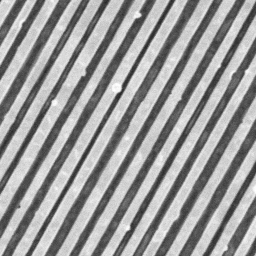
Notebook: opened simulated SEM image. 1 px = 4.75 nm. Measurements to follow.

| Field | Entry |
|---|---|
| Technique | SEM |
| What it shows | parallel lines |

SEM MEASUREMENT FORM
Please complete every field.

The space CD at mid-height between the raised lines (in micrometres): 0.0471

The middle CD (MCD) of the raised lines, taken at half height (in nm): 47.1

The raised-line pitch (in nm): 90.8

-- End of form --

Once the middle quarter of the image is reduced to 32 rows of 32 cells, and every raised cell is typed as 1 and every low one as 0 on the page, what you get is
00011100011000111001110001110001
00111000110001110011100011100011
01111001110001110011100011100111
01110001100011100111000111000111
11100011100011100110000110001110
11100011000111001110001110001110
11000111000111001100001100011100
11000110001110011000011100011000
10001100011100111000111000111000
10011100011100110000111000110001
00011000111001110001110001110001
00111000111001100011110011100011
00110001110011100011100011100011
01100001100111000111000111000110
01100011100111000111000110001110
11000011001110001110001110001100
11000111001100001110001100011100
10001110011100011100011100011001
10001110011000011100111000111001
00011100111000111000111000110011
00011101110000111001110001110011
00111001110001110001110011100111
00110011100011100011100011000110
01110011100011100011000111001110
11100111000111000111000110011100
11100111000111000110001110011000
11001110001110001110001100111000
11001100001110011100011100111001
10011100011100011100011001110001
10011000011100111000110001100011
00111000111000110001110011100011
01110001110001110001100011000111